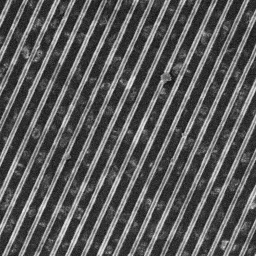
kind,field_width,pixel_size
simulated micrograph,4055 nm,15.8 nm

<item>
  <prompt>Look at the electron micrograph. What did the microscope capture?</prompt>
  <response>parallel lines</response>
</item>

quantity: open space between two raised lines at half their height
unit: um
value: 0.177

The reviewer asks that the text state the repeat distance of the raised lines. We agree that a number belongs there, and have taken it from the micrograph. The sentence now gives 0.228 µm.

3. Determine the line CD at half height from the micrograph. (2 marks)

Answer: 54.2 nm